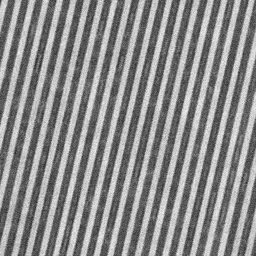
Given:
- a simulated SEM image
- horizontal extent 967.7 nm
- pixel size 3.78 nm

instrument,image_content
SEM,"parallel lines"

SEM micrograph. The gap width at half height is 27.7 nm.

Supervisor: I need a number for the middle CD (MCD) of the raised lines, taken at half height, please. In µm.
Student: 0.0208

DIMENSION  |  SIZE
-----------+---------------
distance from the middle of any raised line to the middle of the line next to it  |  0.0506 microns